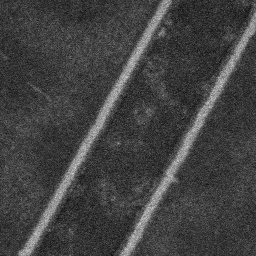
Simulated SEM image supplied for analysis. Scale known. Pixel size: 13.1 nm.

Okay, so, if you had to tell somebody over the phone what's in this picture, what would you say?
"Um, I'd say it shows one or a few lines or trenches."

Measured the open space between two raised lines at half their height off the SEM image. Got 1150 nm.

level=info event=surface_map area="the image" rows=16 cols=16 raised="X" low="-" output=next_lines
XXXXXXXXXX------
XXXXXXXXXX------
XXXXXXXXX------X
XXXXXXXX-------X
XXXXXXXX------XX
XXXXXXX-------XX
XXXXXXX------XXX
XXXXXX------XXXX
XXXXXX------XXXX
XXXXX------XXXXX
XXXXX------XXXXX
XXXX------XXXXXX
XXX-------XXXXXX
XXX------XXXXXXX
XX-------XXXXXXX
XX------XXXXXXXX